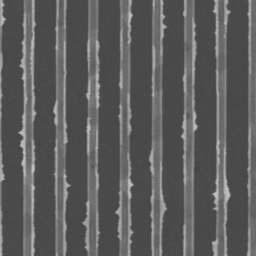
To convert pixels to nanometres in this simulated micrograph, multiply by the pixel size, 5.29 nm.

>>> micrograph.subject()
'parallel lines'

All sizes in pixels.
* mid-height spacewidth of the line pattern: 21.9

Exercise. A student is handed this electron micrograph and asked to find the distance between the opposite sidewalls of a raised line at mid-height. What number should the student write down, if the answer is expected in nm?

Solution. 53.6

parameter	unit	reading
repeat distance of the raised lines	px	32.1